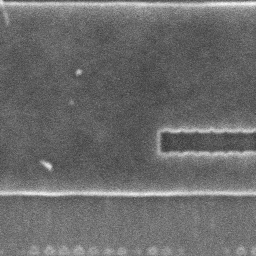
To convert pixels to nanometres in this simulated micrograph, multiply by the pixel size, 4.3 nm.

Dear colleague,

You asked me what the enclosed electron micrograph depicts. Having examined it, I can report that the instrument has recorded wiring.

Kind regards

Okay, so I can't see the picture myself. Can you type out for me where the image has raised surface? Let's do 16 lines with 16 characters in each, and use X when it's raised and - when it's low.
XXXXXXXXXXXXXXXX
XXXXXXXXXXXXXXXX
XXXXXXXXXXXXXXXX
XXXXXXXXXXXXXXXX
XXXXXXXXXXXXXXXX
XXXXXXXXXXXXXXXX
XXXXXXXXXXXXXXXX
XXXXXXXXXXXXXXXX
XXXXXXXXXX------
XXXXXXXXXX------
XXXXXXXXXXXXXXXX
XXXXXXXXXXXXXXXX
----------------
----------------
----------------
----------------